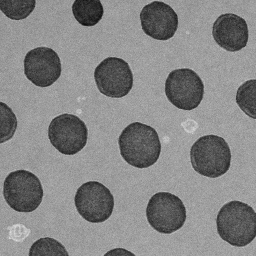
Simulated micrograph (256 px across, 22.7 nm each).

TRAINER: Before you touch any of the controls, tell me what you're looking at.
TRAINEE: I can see a regular array of holes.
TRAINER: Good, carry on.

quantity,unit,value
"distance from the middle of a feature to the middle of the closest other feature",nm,1640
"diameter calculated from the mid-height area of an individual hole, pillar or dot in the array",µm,0.923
